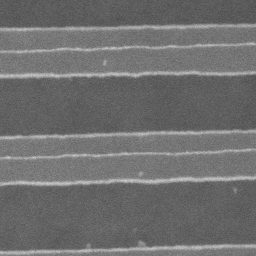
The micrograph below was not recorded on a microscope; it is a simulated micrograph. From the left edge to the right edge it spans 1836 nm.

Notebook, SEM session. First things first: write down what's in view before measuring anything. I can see lines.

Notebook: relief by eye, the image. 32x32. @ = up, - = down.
--------------------------------
--------------------------------
--------------------------------
----------------@@@@@@@@@@@@@@@@
@@@@@@@@@@@@@@@@@@@@@@@@@@@@@@@@
@@@@@@@@@@@@@@@@@@@@@@@@@@@@@@@@
@@@@@@@@@@@@@@@@@@@@@@@@@@@@@@@@
@@@@@@@@@@@@@@@@@@@@@@@@@@@@@@@@
@@@@@@@@@@@@@@@@@@@@@@@@@@@@@@@@
--------------------------------
--------------------------------
--------------------------------
--------------------------------
--------------------------------
--------------------------------
--------------------------------
-------------------------------@
@@@@@@@@@@@@@@@@@@@@@@@@@@@@@@@@
@@@@@@@@@@@@@@@@@@@@@@@@@@@@@@@@
@@@@@@@@@@@@@@@@@@@@@@@@@@@@@@@@
@@@@@@@@@@@@@@@@@@@@@@@@@@@@@@@@
@@@@@@@@@@@@@@@@@@@@@@@@@@@@@@@@
@@@@@@@@@@@@@@@@@@@@@-----------
--------------------------------
--------------------------------
--------------------------------
--------------------------------
--------------------------------
--------------------------------
--------------------------------
--------------------------------
----@@@@@@@@@@@@@@@@@@@@@@@@@@@@